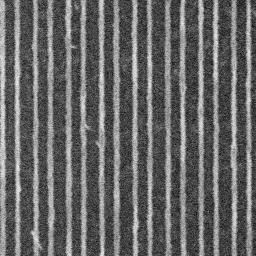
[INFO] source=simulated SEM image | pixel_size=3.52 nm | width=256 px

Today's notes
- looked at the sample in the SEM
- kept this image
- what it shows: parallel lines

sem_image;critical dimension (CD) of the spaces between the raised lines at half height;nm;41.3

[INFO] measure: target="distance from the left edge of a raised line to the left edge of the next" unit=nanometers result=57.9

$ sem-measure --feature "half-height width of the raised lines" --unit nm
14.5